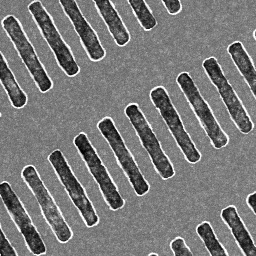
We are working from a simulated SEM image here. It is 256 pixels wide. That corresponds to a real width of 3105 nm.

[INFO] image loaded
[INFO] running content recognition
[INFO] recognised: a regular array of holes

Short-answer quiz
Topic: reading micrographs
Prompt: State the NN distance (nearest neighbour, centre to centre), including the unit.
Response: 364 nm